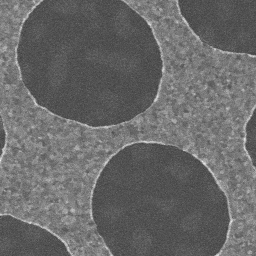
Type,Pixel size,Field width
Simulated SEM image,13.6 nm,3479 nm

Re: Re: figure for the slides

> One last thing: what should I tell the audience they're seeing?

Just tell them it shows holes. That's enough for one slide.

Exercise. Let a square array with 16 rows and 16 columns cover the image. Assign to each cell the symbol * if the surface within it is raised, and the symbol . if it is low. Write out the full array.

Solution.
**......***.....
*........***....
*.........***...
*.........******
*.........******
**........******
**.......*******
****....********
***************.
*******.....***.
*******......***
******........**
******........**
.*****........**
...***........**
....***.......**